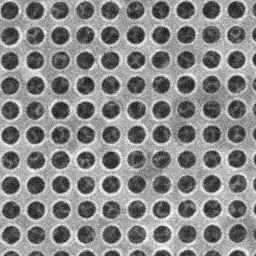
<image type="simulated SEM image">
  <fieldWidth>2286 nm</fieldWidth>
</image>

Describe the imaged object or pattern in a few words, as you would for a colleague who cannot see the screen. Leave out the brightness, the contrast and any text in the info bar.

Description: a regular array of holes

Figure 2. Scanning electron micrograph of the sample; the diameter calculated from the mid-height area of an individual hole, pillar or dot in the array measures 171 nm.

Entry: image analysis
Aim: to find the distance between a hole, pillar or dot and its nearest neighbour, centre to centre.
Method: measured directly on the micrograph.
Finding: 221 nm